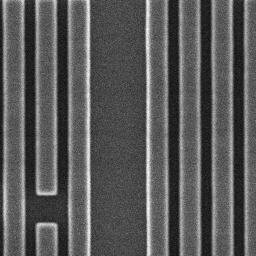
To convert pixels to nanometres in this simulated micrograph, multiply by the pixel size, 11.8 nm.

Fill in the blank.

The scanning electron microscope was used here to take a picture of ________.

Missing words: groups of lines, slits or small figures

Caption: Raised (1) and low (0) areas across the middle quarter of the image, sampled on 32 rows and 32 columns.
01111100000000000000011111000111
01111100000000000000011111000111
01111100000000000000011111000111
01111100000000000000011111000111
01111100000000000000011111000111
01111100000000000000011111000111
01111100000000000000011111000111
01111100000000000000011111000111
01111100000000000000011111000111
01111100000000000000011111000111
01111100000000000000011111000111
01111100000000000000011111000111
01111100000000000000011111000111
01111100000000000000011111000111
01111100000000000000011111000111
01111100000000000000011111000111
01111100000000000000011111000111
01111100000000000000011111000111
01111100000000000000011111000111
01111100000000000000011111000111
01111100000000000000011111000111
01111100000000000000011111000111
01111100000000000000011111000111
01111100000000000000011111000111
01111100000000000000011111000111
01111100000000000000011111000111
01111100000000000000011111000111
01111100000000000000011111000111
01111100000000000000011111000111
01111100000000000000011111000111
01111100000000000000011111000111
01111100000000000000011111000111